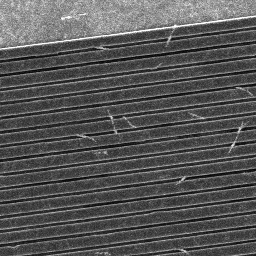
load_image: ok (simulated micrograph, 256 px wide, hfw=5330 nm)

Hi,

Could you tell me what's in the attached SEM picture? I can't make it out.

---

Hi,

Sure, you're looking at parallel lines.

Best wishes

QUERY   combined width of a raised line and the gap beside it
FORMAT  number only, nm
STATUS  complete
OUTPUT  292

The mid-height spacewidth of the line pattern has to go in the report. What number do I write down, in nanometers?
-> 62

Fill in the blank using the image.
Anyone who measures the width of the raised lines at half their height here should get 0.225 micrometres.